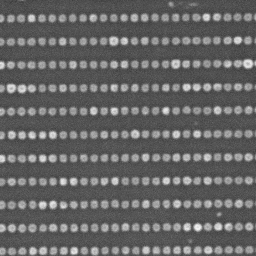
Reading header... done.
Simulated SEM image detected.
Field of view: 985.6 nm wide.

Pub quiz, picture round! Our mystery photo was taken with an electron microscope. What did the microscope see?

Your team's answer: a regular array of raised bodies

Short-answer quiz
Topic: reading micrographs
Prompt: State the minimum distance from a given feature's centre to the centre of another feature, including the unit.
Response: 38.8 nm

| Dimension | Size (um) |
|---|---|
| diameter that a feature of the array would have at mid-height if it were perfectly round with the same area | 0.0271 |